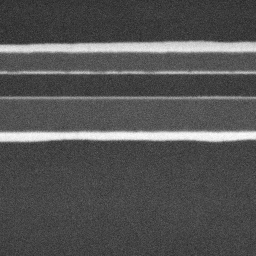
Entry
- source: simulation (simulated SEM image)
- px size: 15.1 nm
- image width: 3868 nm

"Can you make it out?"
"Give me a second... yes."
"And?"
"lines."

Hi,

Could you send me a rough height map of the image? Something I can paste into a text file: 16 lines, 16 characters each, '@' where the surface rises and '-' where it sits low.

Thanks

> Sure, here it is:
----------------
----------------
----------------
@@@@@@@@@@@@@@@@
@@@@@@@@@@@@@@@@
@@@@@@@@@@@@@@@@
@@@@@@@@@@@@@@@@
@@@@@@@@@@@@@@@@
@@@----------@--
----------------
----------------
----------------
----------------
----------------
----------------
----------------